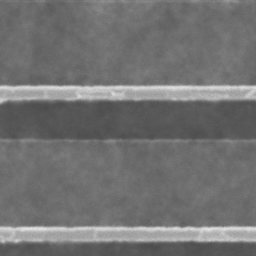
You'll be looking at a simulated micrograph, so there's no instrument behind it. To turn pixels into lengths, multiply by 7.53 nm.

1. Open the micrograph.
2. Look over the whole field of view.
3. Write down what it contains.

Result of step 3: lines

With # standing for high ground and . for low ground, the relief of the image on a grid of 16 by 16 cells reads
################
################
################
################
################
################
................
................
................
################
################
################
################
################
################
................